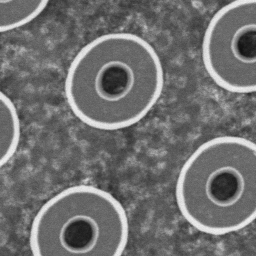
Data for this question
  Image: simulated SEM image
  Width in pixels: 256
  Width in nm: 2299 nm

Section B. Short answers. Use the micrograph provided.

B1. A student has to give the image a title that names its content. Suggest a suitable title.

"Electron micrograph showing ring-shaped raised bodies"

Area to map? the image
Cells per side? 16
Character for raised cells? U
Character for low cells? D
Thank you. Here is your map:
UUUDDDDDDDDDDDUU
UDDDDDDDDDDDDUUU
DDDDDDUUUDDDDUUD
DDDDDUUUUUDDDUUD
DDDDUUDDUUDDDUUU
DDDDUUDDUUDDDDUU
UDDDDUUUUDDDDDDD
UDDDDUUUDDDDDDDD
UDDDDDDDDDDDDDDD
UDDDDDDDDDDDUUUU
DDDDDDDDDDDDUUUU
DDDDDDDDDDDUUDDU
DDDUUUUDDDDUUUUU
DDUUUUUUDDDDUUUU
DDUUDDUUDDDDDDDD
DDUUDUUUDDDDDDDD